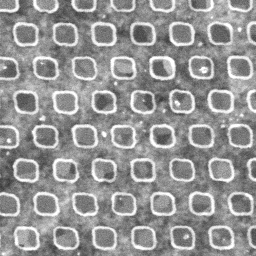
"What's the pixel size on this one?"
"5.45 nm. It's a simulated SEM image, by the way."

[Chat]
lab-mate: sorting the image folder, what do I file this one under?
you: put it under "a regular array of raised bodies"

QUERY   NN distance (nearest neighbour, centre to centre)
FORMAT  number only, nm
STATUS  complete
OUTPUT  210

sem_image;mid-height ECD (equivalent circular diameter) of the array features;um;0.129